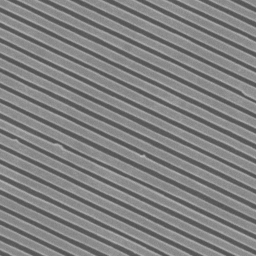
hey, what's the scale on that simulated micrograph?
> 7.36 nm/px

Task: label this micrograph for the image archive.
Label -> parallel lines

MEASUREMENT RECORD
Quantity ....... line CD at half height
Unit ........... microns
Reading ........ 0.0631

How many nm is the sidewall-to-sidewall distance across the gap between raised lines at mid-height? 38.2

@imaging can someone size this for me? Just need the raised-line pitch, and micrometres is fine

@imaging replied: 0.101